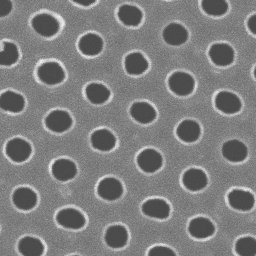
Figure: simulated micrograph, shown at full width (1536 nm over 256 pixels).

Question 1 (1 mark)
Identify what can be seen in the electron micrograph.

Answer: a regular array of holes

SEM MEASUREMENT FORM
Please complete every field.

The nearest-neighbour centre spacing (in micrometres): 0.29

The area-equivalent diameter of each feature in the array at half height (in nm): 136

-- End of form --